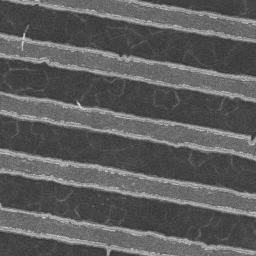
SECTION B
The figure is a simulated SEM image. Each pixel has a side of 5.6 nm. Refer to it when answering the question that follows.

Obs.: parallel lines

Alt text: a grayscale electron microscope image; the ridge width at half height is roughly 0.114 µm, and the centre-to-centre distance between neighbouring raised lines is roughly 0.318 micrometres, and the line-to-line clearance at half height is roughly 0.203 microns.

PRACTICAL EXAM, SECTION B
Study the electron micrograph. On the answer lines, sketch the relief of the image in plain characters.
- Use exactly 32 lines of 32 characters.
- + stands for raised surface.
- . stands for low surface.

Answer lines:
.....+++++++++++++..............
...........++++++++++++++.......
................+++++++++++++++.
......................++++++++++
+...........................++++
++++++..........................
+++++++++++++...................
...+++++++++++++++..............
.........+++++++++++++++........
...............++++++++++++++...
....................++++++++++++
..........................++++++
+++++..........................+
++++++++++......................
..++++++++++++++................
.......+++++++++++++++..........
..............++++++++++++++....
...................+++++++++++++
.........................+++++++
+++............................+
+++++++++.......................
.++++++++++++++.................
.......++++++++++++++...........
.............++++++++++++++.....
..................++++++++++++++
........................++++++++
+++..........................+++
+++++++++.......................
++++++++++++++..................
.....+++++++++++++++............
...........++++++++++++++.......
.................+++++++++++++++